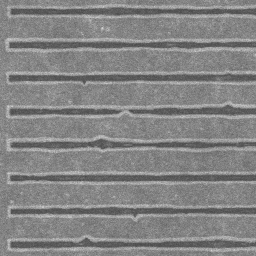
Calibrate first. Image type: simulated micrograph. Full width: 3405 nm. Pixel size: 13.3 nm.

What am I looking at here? parallel lines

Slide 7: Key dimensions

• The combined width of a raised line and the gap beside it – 442 nm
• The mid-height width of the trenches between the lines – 121 nm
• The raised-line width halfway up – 316 nanometres